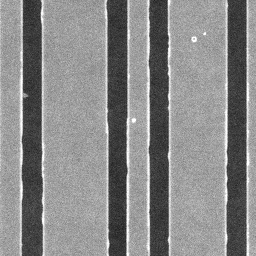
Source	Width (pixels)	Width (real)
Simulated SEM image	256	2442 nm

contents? lines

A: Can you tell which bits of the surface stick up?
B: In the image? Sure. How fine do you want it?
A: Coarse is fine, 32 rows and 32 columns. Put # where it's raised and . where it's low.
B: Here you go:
###..########...###..#######...#
###..########...###..#######...#
###..########...###..#######...#
###..########...###..#######...#
###..########...###..#######...#
###..########...###..#######...#
###..########...###..#######...#
###..########...##...#######...#
###..########...###..#######...#
###..########...###..#######...#
###..########...###..#######...#
###..########...###..#######...#
###..########...###..#######...#
###..########...###..#######...#
###..########...###..#######...#
###..########...###..#######...#
###..########...###..#######...#
###..########...###..#######...#
###..########...###..#######...#
###..########...###..#######...#
###..########...###..#######...#
###..########...###..#######...#
###..########...###..#######...#
###..########...###..#######...#
###..########...###..#######...#
###..########...###..#######...#
###..########...###..#######...#
###..########...###..#######...#
###..########...###..#######...#
###..########...###..#######...#
###..#########..###..#######...#
###..#########..###..#######...#